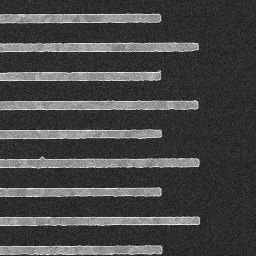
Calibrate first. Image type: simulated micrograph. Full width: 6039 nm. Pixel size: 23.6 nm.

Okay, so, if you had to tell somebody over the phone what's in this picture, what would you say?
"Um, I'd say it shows parallel lines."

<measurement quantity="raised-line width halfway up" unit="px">8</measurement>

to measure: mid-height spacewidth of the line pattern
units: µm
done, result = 0.495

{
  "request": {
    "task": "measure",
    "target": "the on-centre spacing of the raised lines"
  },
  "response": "0.683 µm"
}